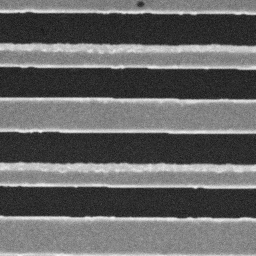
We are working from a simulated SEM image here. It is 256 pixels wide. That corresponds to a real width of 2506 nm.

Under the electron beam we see lines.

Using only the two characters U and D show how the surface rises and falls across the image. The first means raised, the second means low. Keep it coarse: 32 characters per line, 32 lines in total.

UUUUUUUUUUUUUUUUUUUUUUUUUUUUUUUU
DUDDUUUUUUUUUUUUUUUUUUUUUUUUUUUU
DDDDDDDDDDDDDDDDDDDDDDDDDDDDDDDD
DDDDDDDDDDDDDDDDDDDDDDDDDDDDDDDD
DDDDDDDDDDDDDDDDDDDDDDDDDDDDDDDD
DDDDDDDDDDDDDDDDDDDDDDDDDDDDDDDD
UUUUUUUUUUUUUUUUUUUUUUUUUUUUUUUU
UUUUUUUUUUUUUUUUUUUUUUUUUUUUUUUU
DDDDDDDDDDDDDDUDDDUUUUUUUUUUUUUU
DDDDDDDDDDDDDDDDDDDDDDDDDDDDDDDD
DDDDDDDDDDDDDDDDDDDDDDDDDDDDDDDD
DDDDDDDDDDDDDDDDDDDDDDDDDDDDDDDD
UUUUUUUUUUUUUUUUUUDUUUDDDDDDDDDD
UUUUUUUUUUUUUUUUUUUUUUUUUUUUUUUU
UUUUUUUUUUUUUUUUUUUUUUUUUUUUUUUU
UUUUUUUUUUUUUUUUUUUUUUUUUUUUUUUU
DDUUDDDUUUUUUUUUUUUUUUUUUUUUUUUU
DDDDDDDDDDDDDDDDDDDDDDDDDDDDDDDD
DDDDDDDDDDDDDDDDDDDDDDDDDDDDDDDD
DDDDDDDDDDDDDDDDDDDDDDDDDDDDDDDD
DDDDDDDDDDDDDDDDDDDDDDDDDDDDDDDD
UUUUUUUUUUUUUUUUUUUUUUUUUUUUUUUU
UUUUUUUUUUUUUUUUUUUUUUUUUUUUUUUU
DDDDDDDDDDDDDDDDDDDDDDDDDDDDDDDD
DDDDDDDDDDDDDDDDDDDDDDDDDDDDDDDD
DDDDDDDDDDDDDDDDDDDDDDDDDDDDDDDD
DDDDDDDDDDDDDDDDDDDDDDDDDDDDDDDD
UUUUUUUUUUUUUUUUUUUUUUUUUUUUUUUU
UUUUUUUUUUUUUUUUUUUUUUUUUUUUUUUU
UUUUUUUUUUUUUUUUUUUUUUUUUUUUUUUU
UUUUUUUUUUUUUUUUUUUUUUUUUUUUUUUU
UUUUUUUUUUUUUUUUUUUUUUUUUUUUUUUU